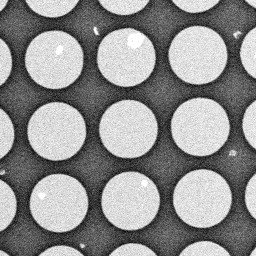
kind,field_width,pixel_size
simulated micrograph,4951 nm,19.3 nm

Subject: an array of small figures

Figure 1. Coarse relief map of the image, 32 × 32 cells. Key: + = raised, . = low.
+..+++++++...+++++....+++++....+
....+++++.....+++...............
................................
.......................+++......
.....++++....+++++....+++++....+
+...++++++...++++++..+++++++..++
+..+++++++..+++++++..+++++++..++
+..+++++++..+++++++..+++++++..++
+..+++++++..+++++++...++++++...+
+...++++++...++++++...+++++.....
.....++++.....+++...............
................................
........................++......
.....++++.....++++....++++++...+
+...++++++...++++++...++++++...+
++..+++++++..+++++++.++++++++.++
++.++++++++.++++++++.++++++++.++
++..+++++++..++++++...++++++...+
+...++++++...++++++....++++.....
.....++++......++...............
................................
........................+++.....
.....+++++....+++++....+++++...+
+...++++++...+++++++..+++++++..+
++..+++++++..+++++++..+++++++..+
++..+++++++..+++++++..+++++++..+
++..+++++++..+++++++..+++++++..+
+...++++++....+++++....+++++....
+.....+++......+++..............
................................
........................+++.....
.....+++++....+++++....+++++....